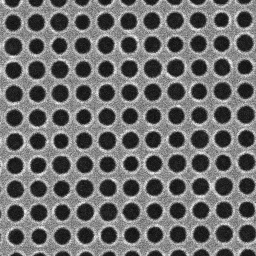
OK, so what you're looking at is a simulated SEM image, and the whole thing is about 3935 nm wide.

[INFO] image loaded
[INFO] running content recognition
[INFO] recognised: a regular array of holes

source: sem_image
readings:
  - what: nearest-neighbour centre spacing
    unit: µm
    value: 0.354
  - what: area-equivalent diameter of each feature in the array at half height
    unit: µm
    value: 0.273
